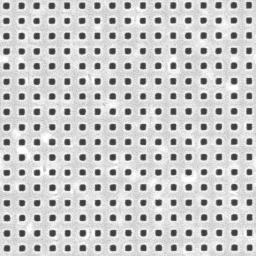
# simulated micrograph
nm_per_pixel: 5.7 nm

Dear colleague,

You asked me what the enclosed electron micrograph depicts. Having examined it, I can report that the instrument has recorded a regular array of holes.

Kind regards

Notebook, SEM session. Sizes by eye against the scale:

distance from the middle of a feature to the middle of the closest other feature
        83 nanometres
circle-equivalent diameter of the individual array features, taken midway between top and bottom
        41.6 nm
